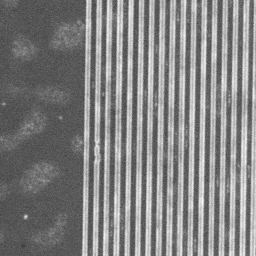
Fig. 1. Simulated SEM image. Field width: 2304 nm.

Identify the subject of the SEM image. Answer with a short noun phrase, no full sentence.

parallel lines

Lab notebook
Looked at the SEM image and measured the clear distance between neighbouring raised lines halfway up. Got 59.6 nanometres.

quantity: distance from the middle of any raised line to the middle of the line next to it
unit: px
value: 10.5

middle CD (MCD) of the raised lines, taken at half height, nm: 33.8